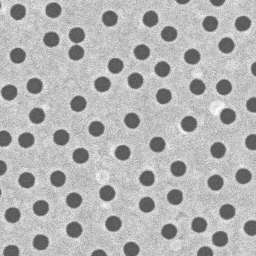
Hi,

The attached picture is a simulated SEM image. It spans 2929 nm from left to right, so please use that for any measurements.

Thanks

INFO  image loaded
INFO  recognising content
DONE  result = a regular array of holes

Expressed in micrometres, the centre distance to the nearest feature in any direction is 0.322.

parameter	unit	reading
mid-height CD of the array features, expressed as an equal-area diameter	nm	187